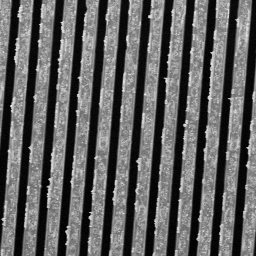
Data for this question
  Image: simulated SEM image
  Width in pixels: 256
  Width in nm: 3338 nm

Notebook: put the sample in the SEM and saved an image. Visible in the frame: parallel lines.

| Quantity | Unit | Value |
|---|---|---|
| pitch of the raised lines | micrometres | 0.284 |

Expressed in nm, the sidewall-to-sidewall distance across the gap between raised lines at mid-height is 114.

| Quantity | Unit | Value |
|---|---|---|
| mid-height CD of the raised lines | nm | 164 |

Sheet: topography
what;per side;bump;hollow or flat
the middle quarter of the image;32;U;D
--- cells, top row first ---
UUDDUUUDDDUUUDDUUUDDDUUUDDUUUDDD
UUDDUUUDDDUUUDDUUUDDDUUUDDUUUDDU
UUDDUUUDDDUUUDDUUUDDDUUDDDUUUDDU
UUDDUUUDDDUUDDDUUUDDUUUDDDUUUDDU
UUDDUUUDDUUUDDDUUUDDUUUDDUUUUDDU
UDDDUUUDDUUUDDDUUUDDUUUDDDUUUDDU
UDDDUUUDDUUUDDDUUUDDUUUDDDUUUDDU
UDDUUUUDDUUUDDDUUUDDUUUDDDUUUDDU
UDDUUUUDDUUUDDDUUUDDUUUDDDUUUDDU
UDDUUUUDDUUUDDDUUUDDUUUDDUUUDDDU
UDDDUUUDDUUUDDUUUUDDUUUDDUUUDDDU
UDDUUUUDDUUUDDUUUDDDUUUDDUUUDDDU
UDDUUUDDDUUUDDUUUDDDUUUDDUUUDDDU
UDDUUUDDDUUUDDUUUDDDUUUDDUUUDDDU
UDDUUUDDDUUUDDUUUDDDUUUDDUUUDDUU
UDDUUUDDDUUUDDUUUDDUUUDDDUUUDDUU
UDDUUUDDUUUDDDUUUDDUUUDDDUUUDDUU
DDDUUUDDUUUDDDUUUDDUUUDDDUUUDDUU
DDDUUUDDUUUDDDUUUDDUUUDDDUUUDDUU
DDDUUUDDUUUDDDUUUDDUUUDDDUUUDDUU
DDDUUUDDUUUDDDUUUDDUUUDDDUUUDDUU
DDDUUUDDUUUDDDUUUDDUUUDDDUUUDDUU
DDDUUUDDUUUDDDUUUDDUUUDDUUUDDDUU
DDUUUUDDUUUDDDUUDDDUUUDDUUUDDDUU
DDUUUDDDUUUDDUUUDDUUUUDDUUUDDDUU
DDUUUDDDUUUDDUUUDDUUUUDDUUUDDDUU
DDUUUDDDUUUDDUUUDDDUUUDDUUUDDDUU
DDUUUDDDUUUDDUUUDDDUUDDDUUUDDUUU
DDUUUDDDUUDDDUUUDDUUUDDDUUUDDUUU
DDUUUDDUUUDDDUUUDDUUUDDDUUUDDUUU
DDUUUDDUUUDDDUUUDDUUUDDDUUUDDUUU
DDUUUDDUUUDDUUUUDDUUUDDDUUUDDUUU